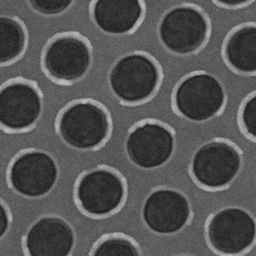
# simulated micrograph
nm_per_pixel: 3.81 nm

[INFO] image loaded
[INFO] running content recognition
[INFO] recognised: a regular array of holes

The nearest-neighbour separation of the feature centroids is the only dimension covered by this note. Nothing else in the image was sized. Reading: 261 nm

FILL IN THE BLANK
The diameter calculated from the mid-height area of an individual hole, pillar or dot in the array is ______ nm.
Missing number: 172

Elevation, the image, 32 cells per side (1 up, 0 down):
11110000011100000111111111110011
11111000111100000011100001111111
00111111111100000111000000111111
00011111111110001111000000111110
00011111111111111111000000111000
00011110001111111111100001110000
00111100000111111111110011110000
01111100000111100001111111111000
11111100000111000001111111111100
11111110001111000000111100111111
11111111111111000001111000011111
00001111111111000001110000001111
00000111111111110111110000001110
00000111100011111111110000011110
00000111000001111111111000111100
10001111000001111111111111111110
11111111000001111000011111111110
11111111000001110000001111111111
11111111110111110000001110000111
11100011111111110000011100000011
11000001111111111000111100000011
10000001111101111111111100000011
10000001110000011111111110000111
11000011110000011111111111111111
11110111110000011110000111111111
11111111110000011100000111111111
01111111111001111100000011110001
01111000111111111100000111000000
01110000011111111110000111000000
11100000011111111111111111000000
11100000011110001111111111100001
11110000011100000111111111110011